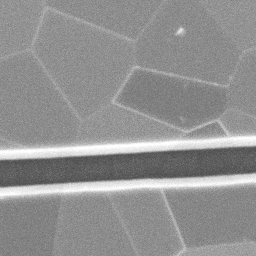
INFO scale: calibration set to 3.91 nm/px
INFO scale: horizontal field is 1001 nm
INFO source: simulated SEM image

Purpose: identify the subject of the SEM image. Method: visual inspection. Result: one or a few lines or trenches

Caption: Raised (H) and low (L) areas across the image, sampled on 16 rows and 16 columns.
HHHHHHHHHHHHHHHH
HHHHHHHHHHHHHHHH
HHHHHHHHHHHHHHHH
HHHHHHHHHHHHHHHH
HHHHHHHHHHHHHHHH
HHHHHHHHHHHHHHHH
HHHHHHHHHHHHHHHH
HHHHHHHHHHHHHHHH
HHHHHHHHHHHHHHHH
HHHLLLLLLLLLLLLL
LLLLLLLLLLLLLLLL
LLLLLLLLLHHHHHHH
HHHHHHHHHHHHHHHH
HHHHHHHHHHHHHHHH
HHHHHHHHHHHHHHHH
HHHHHHHHHHHHHHHH